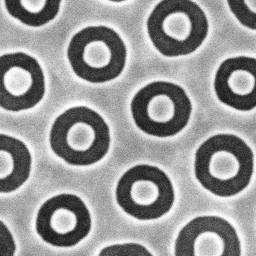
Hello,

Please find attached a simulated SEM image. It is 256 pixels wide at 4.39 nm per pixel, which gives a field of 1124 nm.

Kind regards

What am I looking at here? ring-shaped grooves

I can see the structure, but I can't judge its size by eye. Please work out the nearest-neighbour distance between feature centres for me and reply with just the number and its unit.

369 nanometers